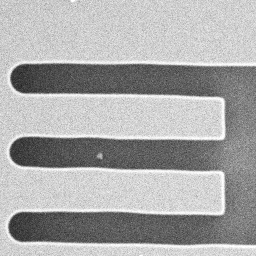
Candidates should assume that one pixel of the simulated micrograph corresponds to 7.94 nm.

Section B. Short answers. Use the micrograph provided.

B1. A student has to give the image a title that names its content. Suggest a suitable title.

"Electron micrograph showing groups of lines, slits or small figures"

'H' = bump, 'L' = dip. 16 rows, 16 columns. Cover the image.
HHHHHHHHHHHHHHHH
HHHHHHHHHHHHHHHH
HHHHHHHHHHHHHHHH
HHHHHHHHHHHHHHHH
HLLLLLLLLLLLLLLL
HLLLLLLLLLLLLLLL
HHHHHHHHHHHHHHLL
HHHHHHHHHHHHHHLL
HHHHHHHHHHHHHHLL
HLLLLLLLLLLLLLLL
HHHLLLLLLLLLLLLL
HHHHHHHHHHHHHHLL
HHHHHHHHHHHHHHLL
HLLLLLLLLLLLLLLL
HLLLLLLLLLLLLLLL
HHHHHHHHHHHHHHHH